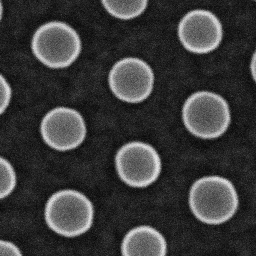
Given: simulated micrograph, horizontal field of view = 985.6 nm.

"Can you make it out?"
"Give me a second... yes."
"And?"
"a regular array of raised bodies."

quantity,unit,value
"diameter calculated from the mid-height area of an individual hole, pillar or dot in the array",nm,165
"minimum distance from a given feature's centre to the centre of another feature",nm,319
